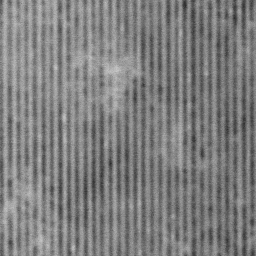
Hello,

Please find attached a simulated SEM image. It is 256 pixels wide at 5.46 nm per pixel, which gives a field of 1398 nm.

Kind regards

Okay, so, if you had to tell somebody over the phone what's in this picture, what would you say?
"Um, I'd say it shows parallel lines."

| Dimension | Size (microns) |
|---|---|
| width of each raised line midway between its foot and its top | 0.0184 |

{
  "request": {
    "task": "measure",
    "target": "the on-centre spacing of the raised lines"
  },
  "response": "45.5 nm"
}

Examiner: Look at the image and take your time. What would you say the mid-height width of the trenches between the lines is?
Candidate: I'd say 25.9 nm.